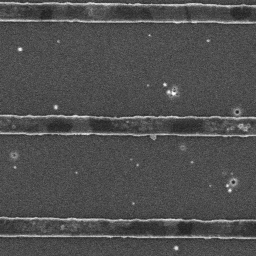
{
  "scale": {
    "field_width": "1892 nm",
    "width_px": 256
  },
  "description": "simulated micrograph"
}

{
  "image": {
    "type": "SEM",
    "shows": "lines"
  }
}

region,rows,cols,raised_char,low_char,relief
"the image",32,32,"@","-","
@@@@@@@@@@@@@@@@-@-----@@-------
@@@@@@@@@@@@@@@@@@@@@@@@@@@@@@@@
-@@@@@@@@@@@@@@@@@@@@@@@@@@@@@@@
--------------------------------
--------------------------------
--------------------------------
--------------------------------
--------------------------------
--------------------------------
--------------------------------
--------------------------------
--------------------------------
--------------------------------
--------------------------------
@@----@-------------------------
@@@@@@@@@@@@@@@@@@@@@@@@@@@@@@@@
@@@@@@@@@@@@@@@@@@@@@@@@@@@@@@@@
--------------------------------
--------------------------------
--------------------------------
--------------------------------
--------------------------------
--------------------------------
--------------------------------
--------------------------------
--------------------------------
--------------------------------
@@@@@@@@@@@@@@----@@-@----------
@@@@@@@@@@@@@@@@@@@@@@@@@@@@@@@@
@@--@@@@@@@@@@@@@@@@@@@@@@@@@@@@
--------------------------------
--------------------------------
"